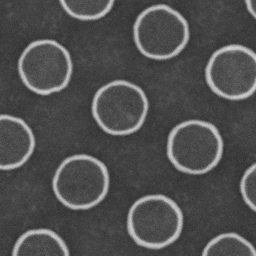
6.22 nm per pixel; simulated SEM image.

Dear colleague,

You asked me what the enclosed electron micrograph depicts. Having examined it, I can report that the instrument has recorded raised bodies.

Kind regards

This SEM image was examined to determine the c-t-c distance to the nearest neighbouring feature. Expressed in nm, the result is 524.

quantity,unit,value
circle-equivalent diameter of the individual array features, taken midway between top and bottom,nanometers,324